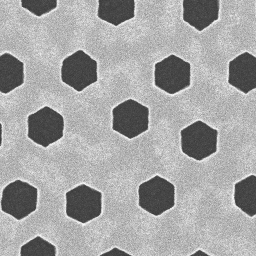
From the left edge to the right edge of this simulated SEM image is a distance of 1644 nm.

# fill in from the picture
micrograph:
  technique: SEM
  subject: a regular array of holes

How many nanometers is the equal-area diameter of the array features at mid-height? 240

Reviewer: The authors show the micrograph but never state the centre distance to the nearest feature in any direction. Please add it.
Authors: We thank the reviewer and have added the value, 64.8 pixels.